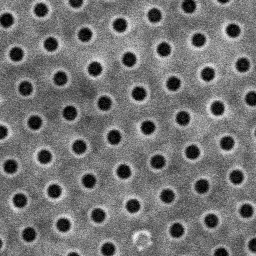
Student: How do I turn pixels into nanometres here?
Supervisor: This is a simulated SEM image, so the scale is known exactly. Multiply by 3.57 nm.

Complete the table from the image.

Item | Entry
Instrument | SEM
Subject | a regular array of holes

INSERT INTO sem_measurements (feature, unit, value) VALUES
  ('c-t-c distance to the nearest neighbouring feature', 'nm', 126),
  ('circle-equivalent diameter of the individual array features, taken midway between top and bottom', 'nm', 55.7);